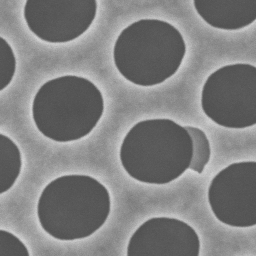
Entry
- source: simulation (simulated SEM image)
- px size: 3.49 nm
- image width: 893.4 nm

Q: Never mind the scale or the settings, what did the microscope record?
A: holes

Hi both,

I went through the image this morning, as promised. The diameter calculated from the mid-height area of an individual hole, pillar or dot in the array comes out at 240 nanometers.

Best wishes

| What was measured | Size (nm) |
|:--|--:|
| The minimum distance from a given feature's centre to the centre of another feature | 346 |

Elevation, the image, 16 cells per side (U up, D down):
UUDDDDUUUUUUDDDD
UUDDDDUUDDDUUDDD
UUUDUUUDDDDUUUUU
DUUUUUUDDDDUUUUU
DUUUUUUUDDDUUDDD
UUUDDDUUUUUUUDDD
UUDDDDUUUUUUUDDD
UUDDDDUUUDDUUDDD
UUUDDUUUDDDDDUUU
DUUUUUUUDDDDDUUU
DUUUUUUUDDDDDUDD
DUUDDDUUUUUUUDDD
UUDDDDDUUUUUUDDD
UUDDDDDUUUUUUUDD
UUUDDDUUDDDDUUUU
DDUUUUUUDDDDUUUU